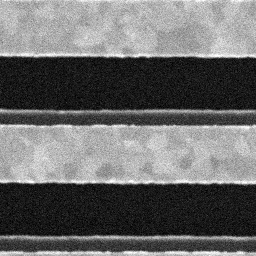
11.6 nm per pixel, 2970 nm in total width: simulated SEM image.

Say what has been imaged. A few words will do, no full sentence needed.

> lines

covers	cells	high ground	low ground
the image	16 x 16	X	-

XXXXXXXXXXXXXXXX
XXXXXXXXXXXXXXXX
XXXXXXXXXXXXXXXX
--X--XXXXXXXXXXX
----------------
----------------
----------------
XXXXXXXXXXXXXXXX
XXXXXXXXXXXXXXXX
XXXXXXXXXXXXXXXX
XXXXXXXXXXXXXXXX
----------------
----------------
----------------
----------------
XXXXXXXXXXXXXXXX